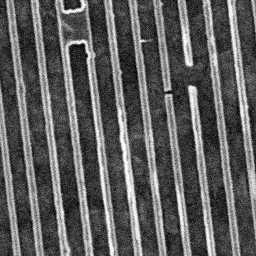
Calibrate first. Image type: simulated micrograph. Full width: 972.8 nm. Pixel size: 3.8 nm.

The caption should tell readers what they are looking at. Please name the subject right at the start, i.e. parallel lines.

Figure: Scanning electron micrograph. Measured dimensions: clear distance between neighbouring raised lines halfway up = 67.9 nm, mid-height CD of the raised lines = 24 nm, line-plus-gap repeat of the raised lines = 92.2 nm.